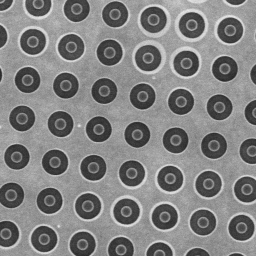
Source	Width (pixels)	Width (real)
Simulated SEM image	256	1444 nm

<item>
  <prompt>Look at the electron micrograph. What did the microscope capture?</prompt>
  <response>an array of small figures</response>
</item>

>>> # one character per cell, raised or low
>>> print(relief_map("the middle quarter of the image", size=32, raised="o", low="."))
oooooooooo..oooooo......ooo.....
ooooooooooooooooooo....oooo.....
..oooooooooooooooooooooooooo....
...ooooooo.ooooooooooooooooooooo
....oooo....oooooooooooooooooooo
....ooo......ooooo....oooooooooo
...oooo......oooo......oooo....o
...oooo......ooo.......oooo.....
..ooooo......ooo.......ooo......
oooooooo....ooooo......ooo......
ooooooooooooooooo.....oooo......
ooooooooooooooooooo.ooooooo.....
.ooooooooooooooooooooooooooo...o
..ooooo...oooooooooooooooooooooo
..oooo.....oooooo..ooooooooooooo
...oo.......oooo.....ooooooooooo
..ooo.......ooo......ooooo....oo
.ooooo......ooo.......ooo......o
oooooo.....oooo.......ooo......o
oooooooo..oooooo.....oooo......o
ooooooooooooooooo...ooooo......o
oooooooooooooooooooooooooo....oo
oooooooooooooooooooooooooooooooo
.oooo.....oooooooooooooooooooooo
.ooo......ooooo....ooooooooooooo
.ooo.......ooo......ooooo...oooo
.ooo.......ooo......oooo.....ooo
oooo......oooo.......oo.......oo
ooooo.....oooo......ooo.......oo
oooooooooooooo......ooo.......oo
ooooooooooooooo....oooo.......oo
ooooooooooooooooooooooooo....ooo